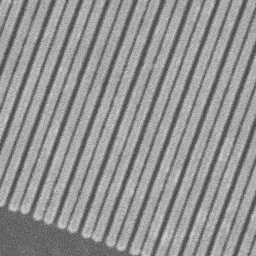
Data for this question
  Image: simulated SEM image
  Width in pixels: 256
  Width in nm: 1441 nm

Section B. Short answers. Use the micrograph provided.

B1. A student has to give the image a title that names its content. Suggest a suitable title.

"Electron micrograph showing parallel lines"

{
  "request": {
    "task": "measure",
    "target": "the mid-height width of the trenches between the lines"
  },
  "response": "27.8 nm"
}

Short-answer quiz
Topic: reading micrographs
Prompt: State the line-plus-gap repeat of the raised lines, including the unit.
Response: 0.0724 microns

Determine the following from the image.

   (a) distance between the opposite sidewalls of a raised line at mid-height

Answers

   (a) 0.0517 µm